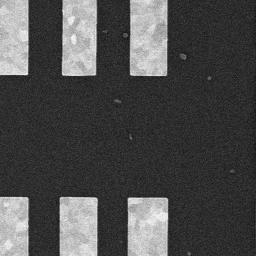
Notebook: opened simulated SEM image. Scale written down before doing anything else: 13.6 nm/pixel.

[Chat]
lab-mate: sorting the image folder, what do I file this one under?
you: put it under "wiring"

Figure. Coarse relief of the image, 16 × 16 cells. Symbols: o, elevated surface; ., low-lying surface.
oo..oo..oo......
oo..oo..oo......
oo..oo..oo......
oo..oo..oo......
oo..oo..oo......
................
................
................
................
................
................
................
o...oo..oo......
oo..oo..oo......
oo..oo..oo......
oo..oo..oo......